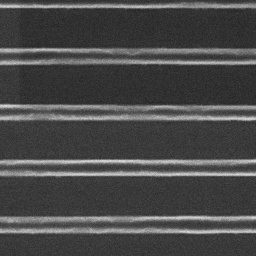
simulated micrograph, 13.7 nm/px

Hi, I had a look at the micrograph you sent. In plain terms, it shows lines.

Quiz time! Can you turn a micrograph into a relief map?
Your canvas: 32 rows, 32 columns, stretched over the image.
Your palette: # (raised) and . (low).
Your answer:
################################
................................
................................
................................
................................
................................
################################
################################
................................
................................
................................
................................
................................
###############...#####....#####
################################
................................
................................
................................
................................
................................
################################
################################
................................
................................
................................
................................
................................
###..###########################
################################
................................
................................
................................